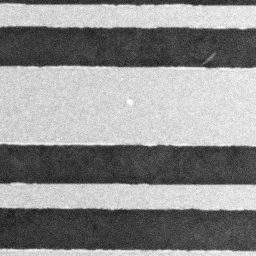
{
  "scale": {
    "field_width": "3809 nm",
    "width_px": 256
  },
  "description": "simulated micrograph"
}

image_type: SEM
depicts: lines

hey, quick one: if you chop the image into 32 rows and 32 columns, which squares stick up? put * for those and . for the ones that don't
................................
********************************
********************************
.............................**.
................................
................................
................................
................................
**************..................
********************************
********************************
********************************
********************************
********************************
********************************
********************************
********************************
********************************
................................
................................
................................
................................
................................
********************************
********************************
********************************
................................
................................
................................
................................
................................
***********************.*****...